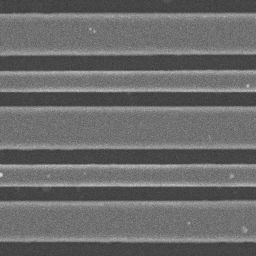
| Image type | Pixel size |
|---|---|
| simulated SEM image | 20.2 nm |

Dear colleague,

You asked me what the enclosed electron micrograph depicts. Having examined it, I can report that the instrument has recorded lines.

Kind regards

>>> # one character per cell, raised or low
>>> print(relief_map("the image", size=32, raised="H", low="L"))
LLLLLLLLLLLLLLLLLLLLLLLLLLLLLLLL
LLLLLLLLLLLLLLLLLLLLLLLLLLLLLLLL
HHHHHHHHHHHHHHHHHHHHHHHHHHHHHHHH
HHHHHHHHHHHHHHHHHHHHHHHHHHHHHHHH
HHHHHHHHHHHHHHHHHHHHHHHHHHHHHHHH
HHHHHHHHHHHHHHHHHHHHHHHHHHHHHHHH
HHHHHHHHHHHHHHHHHHHHHHHHHHHHHHHH
LLLLLLLLLLLLLLLLLLLLLLLLLLLLLLLL
LLLLLLLLLLLLLLLLLLLLLLLLLLLLLLLL
HHHHHHHHHHHHHHHHHHHHHHHHHHHHHHHH
HHHHHHHHHHHHHHHHHHHHHHHHHHHHHHHH
LLLLLLLLLLLLLLLLLLLLLLLLLLLLLLLL
LLLLLLLLLLLLLLLLLLLLLLLLLLLLLLLL
HHHHHHHHHHHHHHHHHHHHHHHHHHHHHHHH
HHHHHHHHHHHHHHHHHHHHHHHHHHHHHHHH
HHHHHHHHHHHHHHHHHHHHHHHHHHHHHHHH
HHHHHHHHHHHHHHHHHHHHHHHHHHHHHHHH
HHHHHHHHHHHHHHHHHHHHHHHHHHHHHHHH
HHHHHHHHHHHHHHHHHHHHHHHHHHHHHHHH
LLLLLLLLLLLLLLLLLLLLLLLLLLLLLLLL
LLLLLLLLLLLLLLLLLLLLLLLLLLLLLLLL
HHHHHHHHHHHHHHHHHHHHHHHHHHHHHHHH
HHHHHHHHHHHHHHHHHHHHHHHHHHHHHHHH
LLLLLLLLLLLLLLLLLLLLLLLLLLLLLLLL
LLLLLLLLLLLLLLLLLLLLLLLLLLLLLLLL
HHHHHHHHHHHHHHHHHHHHHHHHHHHHHHHH
HHHHHHHHHHHHHHHHHHHHHHHHHHHHHHHH
HHHHHHHHHHHHHHHHHHHHHHHHHHHHHHHH
HHHHHHHHHHHHHHHHHHHHHHHHHHHHHHHH
HHHHHHHHHHHHHHHHHHHHHHHHHHHHHHHH
LLLLLLLLLLLLLLLLLLLLLLLLLLLLLLLL
LLLLLLLLLLLLLLLLLLLLLLLLLLLLLLLL